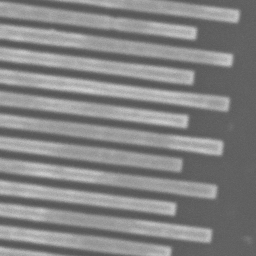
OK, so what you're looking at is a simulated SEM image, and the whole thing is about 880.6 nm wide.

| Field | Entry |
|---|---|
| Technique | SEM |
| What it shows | parallel lines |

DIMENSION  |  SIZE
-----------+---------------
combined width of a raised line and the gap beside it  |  76 nm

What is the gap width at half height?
0.0349 microns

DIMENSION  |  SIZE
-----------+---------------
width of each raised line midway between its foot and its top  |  41.3 nm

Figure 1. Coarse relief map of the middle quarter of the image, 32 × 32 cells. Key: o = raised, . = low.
oooooooooooooooooooo............
.......ooooooooooooooooooooo....
...............ooooooooooooooooo
.....................ooooooooooo
ooooooo......................ooo
ooooooooooooo...................
ooooooooooooooooooooo...........
..........ooooooooooooooooooooo.
..................oooooooooooooo
oo........................oooooo
oooooooooo......................
oooooooooooooooooo..............
.....ooooooooooooooooooooo......
.............oooooooooooooooooo.
.....................oooooooooo.
oooooo.......................o..
ooooooooooooooo.................
.ooooooooooooooooooooo..........
.........oooooooooooooooooooooo.
................oooooooooooooooo
o.o.....................oooooooo
ooooooooooo....................o
ooooooooooooooooo...............
....ooooooooooooooooooooo.......
..........ooooooooooooooooooo...
....................ooooooooo...
oooo........................o...
oooooooooooo....................
oooooooooooooooooooo............
.......ooooooooooooooooooooo....
...............ooooooooooooooooo
.......................ooooooooo